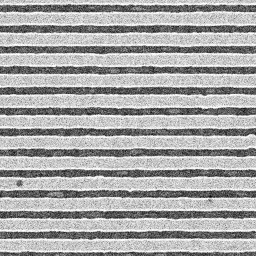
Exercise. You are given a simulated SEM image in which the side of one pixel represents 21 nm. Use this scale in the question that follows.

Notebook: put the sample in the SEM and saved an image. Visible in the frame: parallel lines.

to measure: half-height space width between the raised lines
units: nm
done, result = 186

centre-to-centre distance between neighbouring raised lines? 434 nanometres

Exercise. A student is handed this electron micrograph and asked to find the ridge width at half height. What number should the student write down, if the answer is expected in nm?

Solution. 249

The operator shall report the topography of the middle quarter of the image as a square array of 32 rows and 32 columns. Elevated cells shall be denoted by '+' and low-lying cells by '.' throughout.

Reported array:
.........++++++..+...........+..
............+...+...............
................................
++++++++++++++++++++++++++++++++
++++++++++++++++++++++++++++++++
++++++++++++++++++++++++++++++++
................................
................................
++++++++++++++++++++++++++++++++
++++++++++++++++++++++++++++++++
++++++++++++++++++++++++++++++++
................................
................................
++++++++++++++++++++++++++++++++
++++++++++++++++++++++++++++++++
++++++++++++++++++++++++++++++++
................................
................................
++++++++++++++++++++++++++++++++
++++++++++++++++++++++++++++++++
++++++++++++++++++++++++++++++++
................................
................................
++++++++++++++++++++++++++++++++
++++++++++++++++++++++++++++++++
++++++++++++++++++++++++++++++++
................................
................................
+..+++++++++++.++...+++++.......
++++++++++++++++++++++++++++++++
++++++++++++++++++++++++++++++++
................+...+...........